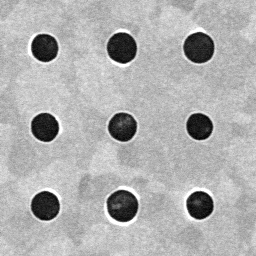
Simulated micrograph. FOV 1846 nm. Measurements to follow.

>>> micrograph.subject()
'a regular array of holes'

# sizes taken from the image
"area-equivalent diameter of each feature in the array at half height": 218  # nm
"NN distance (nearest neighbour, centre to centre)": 0.555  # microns